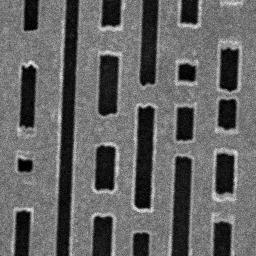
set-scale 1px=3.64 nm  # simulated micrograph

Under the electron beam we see parallel lines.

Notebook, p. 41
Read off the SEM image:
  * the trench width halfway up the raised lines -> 0.0646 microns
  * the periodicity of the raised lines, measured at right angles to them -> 145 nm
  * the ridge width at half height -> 22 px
